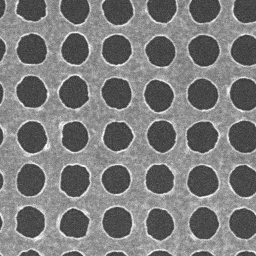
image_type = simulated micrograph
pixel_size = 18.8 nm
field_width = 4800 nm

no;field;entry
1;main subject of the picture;a regular array of holes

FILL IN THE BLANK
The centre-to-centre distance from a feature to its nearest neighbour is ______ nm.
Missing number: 792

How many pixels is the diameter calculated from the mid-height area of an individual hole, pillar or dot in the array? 31.3